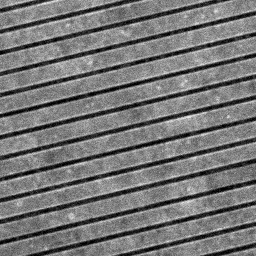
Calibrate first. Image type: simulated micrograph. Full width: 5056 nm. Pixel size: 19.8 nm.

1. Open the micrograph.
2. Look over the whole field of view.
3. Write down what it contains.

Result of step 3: parallel lines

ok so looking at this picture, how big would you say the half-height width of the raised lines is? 305 nm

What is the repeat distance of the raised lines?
405 nm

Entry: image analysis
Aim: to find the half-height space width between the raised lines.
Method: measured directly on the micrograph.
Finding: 103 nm